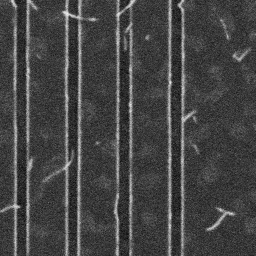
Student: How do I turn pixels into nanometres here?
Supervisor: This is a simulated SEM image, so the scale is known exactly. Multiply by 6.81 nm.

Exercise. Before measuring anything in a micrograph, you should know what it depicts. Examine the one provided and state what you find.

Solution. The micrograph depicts parallel lines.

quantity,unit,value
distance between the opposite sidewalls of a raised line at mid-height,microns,0.278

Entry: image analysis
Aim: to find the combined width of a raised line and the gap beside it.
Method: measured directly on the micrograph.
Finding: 350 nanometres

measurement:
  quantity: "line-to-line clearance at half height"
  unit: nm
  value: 74.9